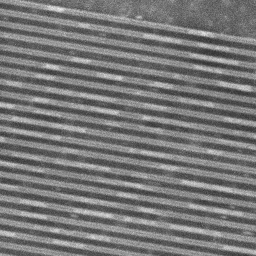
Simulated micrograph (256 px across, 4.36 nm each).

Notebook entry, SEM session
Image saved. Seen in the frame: parallel lines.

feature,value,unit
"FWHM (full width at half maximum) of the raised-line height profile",0.0187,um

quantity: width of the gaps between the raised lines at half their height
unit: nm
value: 33.3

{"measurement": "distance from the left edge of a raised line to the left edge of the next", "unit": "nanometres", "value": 50.1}